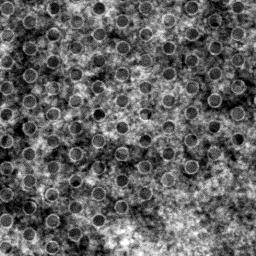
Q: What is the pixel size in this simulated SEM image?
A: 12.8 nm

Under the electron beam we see a regular array of raised bodies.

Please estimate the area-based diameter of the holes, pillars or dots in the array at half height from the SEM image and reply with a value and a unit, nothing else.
170 nm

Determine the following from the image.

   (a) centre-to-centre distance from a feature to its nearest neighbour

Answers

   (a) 26.2 px